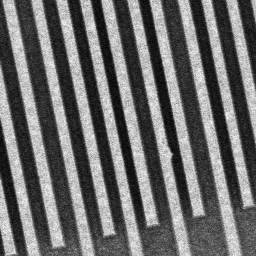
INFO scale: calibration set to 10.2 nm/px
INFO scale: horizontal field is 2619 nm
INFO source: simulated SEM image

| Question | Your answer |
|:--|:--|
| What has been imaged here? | parallel lines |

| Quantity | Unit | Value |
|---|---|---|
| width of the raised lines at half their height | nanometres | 129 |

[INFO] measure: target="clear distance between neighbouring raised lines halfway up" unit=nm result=120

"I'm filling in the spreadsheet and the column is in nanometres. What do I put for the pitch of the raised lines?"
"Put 250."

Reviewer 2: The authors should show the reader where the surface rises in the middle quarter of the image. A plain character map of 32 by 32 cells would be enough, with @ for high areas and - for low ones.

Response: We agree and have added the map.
-@@@---@@@--@@@@---@@@---@@@----
-@@@@--@@@---@@@---@@@---@@@----
--@@@---@@@--@@@----@@---@@@----
--@@@---@@@--@@@----@@@--@@@----
--@@@---@@@--@@@----@@@--@@@----
--@@@---@@@--@@@@---@@@---@@@---
--@@@@--@@@---@@@---@@@---@@@---
---@@@---@@@--@@@---@@@---@@@---
---@@@---@@@--@@@----@@@--@@@---
---@@@---@@@--@@@----@@@--@@@---
---@@@---@@@--@@@@---@@@---@@@--
---@@@@--@@@---@@@---@@@---@@@--
----@@@---@@@--@@@----@@---@@@--
@---@@@---@@@--@@@----@@@--@@@--
@---@@@---@@@--@@@----@@@--@@@--
@---@@@---@@@--@@@@---@@@---@@@-
@---@@@@--@@@---@@@---@@@---@@@-
@----@@@---@@@--@@@----@@@--@@@-
@@---@@@---@@@--@@@----@@@--@@@-
@@---@@@---@@@--@@@----@@@--@@@@
@@---@@@@--@@@--@@@@---@@@---@@@
@@---@@@@--@@@@--@@@---@@@@--@@@
@@----@@@---@@@--@@@----@@@--@@@
@@@---@@@---@@@--@@@----@@@--@@@
@@@---@@@---@@@--@@@@---@@@--@@@
@@@---@@@---@@@--@@@@---@@@---@@
@@@---@@@@--@@@@--@@@---@@@---@@
-@@----@@@---@@@--@@@----@@@--@@
-@@@---@@@---@@@--@@@----@@@--@@
-@@@---@@@---@@@--@@@@---@@@--@@
-@@@---@@@@--@@@---@@@---@@@---@
-@@@---@@@@--@@@@--@@@---@@@---@